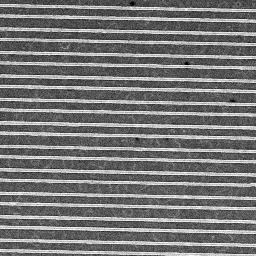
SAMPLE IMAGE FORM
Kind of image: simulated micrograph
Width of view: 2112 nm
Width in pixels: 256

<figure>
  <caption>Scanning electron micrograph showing parallel lines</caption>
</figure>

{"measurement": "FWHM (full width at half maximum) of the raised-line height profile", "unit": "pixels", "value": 2.75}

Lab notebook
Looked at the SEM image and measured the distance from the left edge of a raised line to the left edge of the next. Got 96.4 nanometres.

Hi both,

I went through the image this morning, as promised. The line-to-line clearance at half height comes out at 8.38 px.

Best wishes